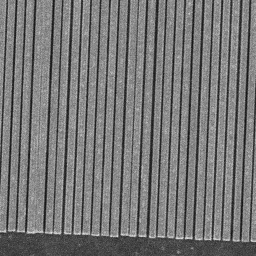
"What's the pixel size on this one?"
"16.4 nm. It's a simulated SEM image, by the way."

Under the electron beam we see parallel lines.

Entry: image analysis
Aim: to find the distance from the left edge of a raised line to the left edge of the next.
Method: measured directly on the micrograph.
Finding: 154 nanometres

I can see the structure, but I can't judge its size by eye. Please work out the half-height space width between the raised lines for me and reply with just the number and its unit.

45.1 nm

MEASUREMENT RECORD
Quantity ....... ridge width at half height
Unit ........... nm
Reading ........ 107